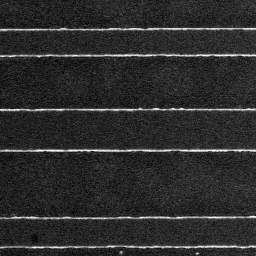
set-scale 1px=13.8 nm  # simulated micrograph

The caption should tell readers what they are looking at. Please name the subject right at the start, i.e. lines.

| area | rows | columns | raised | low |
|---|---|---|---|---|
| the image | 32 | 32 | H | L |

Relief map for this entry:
LLLLLLLLLLLLLLLLLLLLLLLLLLLLLLLL
LLLLLLLLLLLLLLLLLLLLLLLLLLLLLLLL
LLLLLLLLLLLLLLLLLLLLLLLLLLLLLLLL
LLLLLLLLLLLLLLLLLLLLLLLLLLLLLLLL
HHHHHHHHHHHHHHHHHHHHHHHHHHHHHHHH
HHHHHHHHHHHHHHHHHHHHHHHHHHHHHHHH
HHHHHHHHHHHHHHHHHHHHHHHHHHHHHHHH
LLLLLLLLLLLLLLLLLLLLLLLLLLLLLLLL
LLLLLLLLLLLLLLLLLLLLLLLLLLLLLLLL
LLLLLLLLLLLLLLLLLLLLLLLLLLLLLLLL
LLLLLLLLLLLLLLLLLLLLLLLLLLLLLLLL
LLLLLLLLLLLLLLLLLLLLLLLLLLLLLLLL
LLLLLLLLLLLLLLLLLLLLLLLLLLLLLLLL
LLLLLLLLLLLLLLLLLLLLLLLLLLLLLLLL
HHHHHHHHHHHHHHHHHHHHHHHHHHHHHHHH
HHHHHHHHHHHHHHHHHHHHHHHHHHHHHHHH
HHHHHHHHHHHHHHHHHHHHHHHHHHHHHHHH
HHHHHHHHHHHHHHHHHHHHHHHHHHHHHHHH
HHHHHHHHHHHHHHHHHHHHHHHHHHHHHHHH
LLLLLLLLLLLLLLLLLLLLLLLLLLLLLLLL
LLLLLLLLLLLLLLLLLLLLLLLLLLLLLLLL
LLLLLLLLLLLLLLLLLLLLLLLLLLLLLLLL
LLLLLLLLLLLLLLLLLLLLLLLLLLLLLLLL
LLLLLLLLLLLLLLLLLLLLLLLLLLLLLLLL
LLLLLLLLLLLLLLLLLLLLLLLLLLLLLLLL
LLLLLLLLLLLLLLLLLLLLLLLLLLLLLLLL
LLLLLLLLLLLLLLLLLLLLLLLLLLLLLLLL
HHHHHHHHHHHHHHHHHHHHHHHHHHHHHHHH
HHHHHHHHHHHHHHHHHHHHHHHHHHHHHHHH
HHHHHHHHHHHHHHHHHHHHHHHHHHHHHHHH
HHHHHHHHHHHHHHHHHHHHHHHHHHHHHHHH
LLLLLLLLLLLLLLLLLLLLLLLLLLLLLLLL